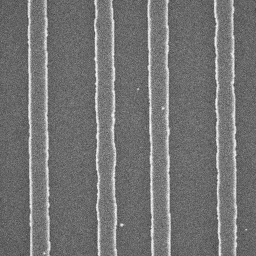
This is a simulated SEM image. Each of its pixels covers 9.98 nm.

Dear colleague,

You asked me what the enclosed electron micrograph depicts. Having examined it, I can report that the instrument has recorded lines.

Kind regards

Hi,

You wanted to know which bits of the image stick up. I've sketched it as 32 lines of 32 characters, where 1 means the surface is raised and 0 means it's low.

00001100000011000001100000011000
00001100000011000001100000011000
00001100000011000001100000011000
00001100000011000001100000011000
00001100000011000001100000011000
00001100000011000001100000011000
00001100000011000001100000011000
00001100000011000001100000011000
00001100000011000001100000011000
00001100000011000001100000011000
00001100000011000001100000011000
00001100000011000001100000011000
00001100000011000001100000011000
00001100000011000001100000011000
00001100000011000001100000011000
00001100000011000001100000011000
00001100000011000001100000011000
00001100000011000001100000011000
00001100000011000001100000011000
00001100000011000001100000011000
00001100000011000001100000011000
00001100000011000001100000011000
00001100000011000001100000011000
00001100000011000001100000011000
00001100000011000001100000011000
00001100000011100001100000011100
00001100000011100001100000011100
00001100000011100001100000011000
00001100000011000001100000011000
00001100000011000001100000011000
00001100000011000001100000011000
00001100000011100001100000011000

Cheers